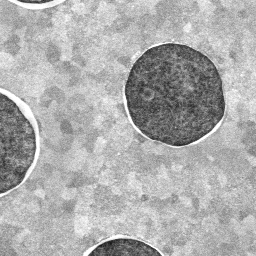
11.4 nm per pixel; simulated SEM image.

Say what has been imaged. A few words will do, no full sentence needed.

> holes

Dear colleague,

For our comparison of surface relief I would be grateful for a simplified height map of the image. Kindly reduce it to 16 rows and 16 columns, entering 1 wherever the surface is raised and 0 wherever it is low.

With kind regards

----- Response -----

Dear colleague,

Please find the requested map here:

1111111111111111
1111111111111111
1111111111111111
1111111110000111
1111111100000011
1111111100000011
0111111100000011
0011111100000011
0011111110000111
0011111111111111
0011111111111111
0111111111111111
1111111111111111
1111111111111111
1111111111111111
1111110000111111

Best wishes